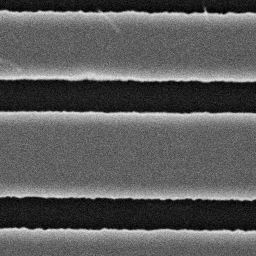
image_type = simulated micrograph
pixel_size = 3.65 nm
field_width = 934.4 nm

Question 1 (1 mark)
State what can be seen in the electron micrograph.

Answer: lines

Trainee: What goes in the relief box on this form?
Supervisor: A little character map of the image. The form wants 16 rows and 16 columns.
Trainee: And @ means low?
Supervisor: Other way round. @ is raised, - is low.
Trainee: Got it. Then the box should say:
----------------
@@@@@@@@@@@@@@@@
@@@@@@@@@@@@@@@@
@@@@@@@@@@@@@@@@
@@@@@@@@@@@@@@@@
----------------
----------------
@@@@@@@@@@@@@@@@
@@@@@@@@@@@@@@@@
@@@@@@@@@@@@@@@@
@@@@@@@@@@@@@@@@
@@@@@@@@@@@@@@@@
---------------@
----------------
@@@@@@@@@@@@@@@@
@@@@@@@@@@@@@@@@